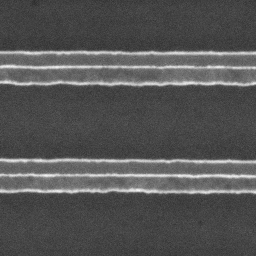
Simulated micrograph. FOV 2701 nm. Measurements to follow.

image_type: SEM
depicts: lines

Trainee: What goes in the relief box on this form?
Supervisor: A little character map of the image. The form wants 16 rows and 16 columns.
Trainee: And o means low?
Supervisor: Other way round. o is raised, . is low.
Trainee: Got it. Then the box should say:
................
................
................
oooooooooooooooo
oooooooooooooooo
................
................
................
................
................
oooooooooooooooo
oooooooooooooooo
................
................
................
................